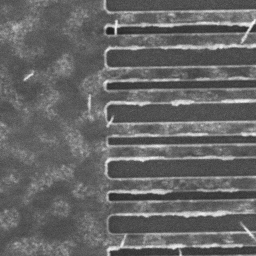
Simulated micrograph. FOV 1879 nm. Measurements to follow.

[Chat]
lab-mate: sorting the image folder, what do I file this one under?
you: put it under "parallel lines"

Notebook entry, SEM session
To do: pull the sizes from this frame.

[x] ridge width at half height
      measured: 106 nm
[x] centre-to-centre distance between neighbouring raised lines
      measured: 204 nanometres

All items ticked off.